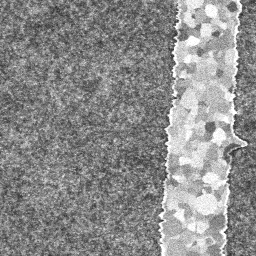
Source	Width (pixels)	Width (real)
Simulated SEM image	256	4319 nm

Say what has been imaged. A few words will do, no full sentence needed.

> one or a few lines or trenches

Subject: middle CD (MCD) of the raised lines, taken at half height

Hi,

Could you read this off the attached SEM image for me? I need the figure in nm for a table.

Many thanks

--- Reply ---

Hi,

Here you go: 1040